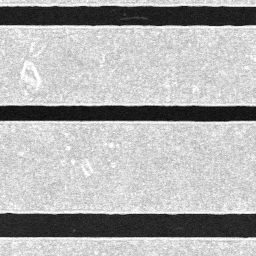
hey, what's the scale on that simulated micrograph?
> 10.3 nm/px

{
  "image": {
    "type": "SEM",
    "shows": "lines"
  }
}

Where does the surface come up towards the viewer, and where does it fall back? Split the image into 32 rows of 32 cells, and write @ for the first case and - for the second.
@@@@@@@@@@@@@@@@@@@@@@@@@@@@@@@@
--------------------------------
--------------------------------
@@@@@@@@@@@@@@@@@@@@@@@@@@@@@@@@
@@@@@@@@@@@@@@@@@@@@@@@@@@@@@@@@
@@@@@@@@@@@@@@@@@@@@@@@@@@@@@@@@
@@@@@@@@@@@@@@@@@@@@@@@@@@@@@@@@
@@@@@@@@@@@@@@@@@@@@@@@@@@@@@@@@
@@@@@@@@@@@@@@@@@@@@@@@@@@@@@@@@
@@@@@@@@@@@@@@@@@@@@@@@@@@@@@@@@
@@@@@@@@@@@@@@@@@@@@@@@@@@@@@@@@
@@@@@@@@@@@@@@@@@@@@@@@@@@@@@@@@
@@@@@@@@@@@@@@@@@@@@@@@@@@@@@@@@
--------------------------------
--------------------------------
@@@@@@@@@@@@@@@@@@@@@@@@@@@@@@@@
@@@@@@@@@@@@@@@@@@@@@@@@@@@@@@@@
@@@@@@@@@@@@@@@@@@@@@@@@@@@@@@@@
@@@@@@@@@@@@@@@@@@@@@@@@@@@@@@@@
@@@@@@@@@@@@@@@@@@@@@@@@@@@@@@@@
@@@@@@@@@@@@@@@@@@@@@@@@@@@@@@@@
@@@@@@@@@@@@@@@@@@@@@@@@@@@@@@@@
@@@@@@@@@@@@@@@@@@@@@@@@@@@@@@@@
@@@@@@@@@@@@@@@@@@@@@@@@@@@@@@@@
@@@@@@@@@@@@@@@@@@@@@@@@@@@@@@@@
@@@@@@@@@@@@@@@@@@@@@@@@@@@@@@@@
@@@@@@@@@@@@@@@@@@@@@@@@@@@@@@@@
--------------------------------
--------------------------------
--------------------------------
@@@@@@@@@@@@@@@@@@@@@@@@@@@@@@@@
@@@@@@@@@@@@@@@@@@@@@@@@@@@@@@@@